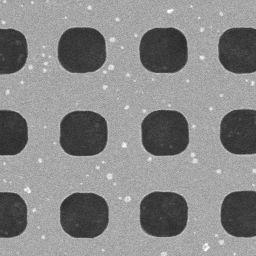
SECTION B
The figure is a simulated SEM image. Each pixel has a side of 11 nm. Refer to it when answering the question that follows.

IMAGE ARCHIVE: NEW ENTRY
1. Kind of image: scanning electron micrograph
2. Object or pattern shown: holes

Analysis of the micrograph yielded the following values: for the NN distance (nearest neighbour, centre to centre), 81.4 pixels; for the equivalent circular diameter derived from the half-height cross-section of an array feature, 0.542 µm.